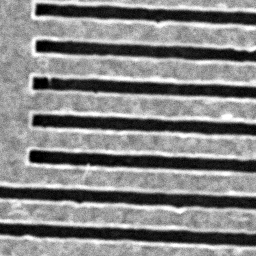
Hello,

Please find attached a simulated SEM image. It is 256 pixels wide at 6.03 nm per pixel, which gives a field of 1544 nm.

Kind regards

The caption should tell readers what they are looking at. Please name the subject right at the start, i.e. parallel lines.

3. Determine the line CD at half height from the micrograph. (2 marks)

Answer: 133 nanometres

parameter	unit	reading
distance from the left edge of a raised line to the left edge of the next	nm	222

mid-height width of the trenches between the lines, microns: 0.0858